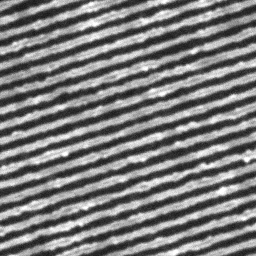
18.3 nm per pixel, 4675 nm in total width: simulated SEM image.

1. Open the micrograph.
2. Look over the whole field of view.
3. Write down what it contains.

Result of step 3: parallel lines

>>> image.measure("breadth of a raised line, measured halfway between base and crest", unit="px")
5.37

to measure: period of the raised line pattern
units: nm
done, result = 262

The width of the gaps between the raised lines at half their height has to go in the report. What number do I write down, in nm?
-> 161